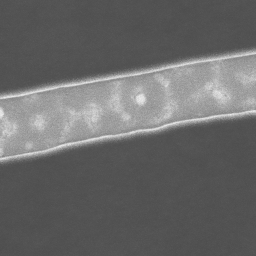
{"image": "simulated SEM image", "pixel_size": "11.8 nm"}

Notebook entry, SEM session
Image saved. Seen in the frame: one or a few lines or trenches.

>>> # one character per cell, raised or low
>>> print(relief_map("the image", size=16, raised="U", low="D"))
UUUUUUUUUUUUUUUU
UUUUUUUUUUUUUUUU
UUUUUUUUUUUUUUUU
UUUUUUUUUUUUUUUD
UUUUUUUUUUDDDDDD
UUUUDDDDDDDDDDDD
DDDDDDDDDDDDDDDD
DDDDDDDDDDDDUUUU
DDDDDDDUUUUUUUUU
DDUUUUUUUUUUUUUU
UUUUUUUUUUUUUUUU
UUUUUUUUUUUUUUUU
UUUUUUUUUUUUUUUU
UUUUUUUUUUUUUUUU
UUUUUUUUUUUUUUUU
UUUUUUUUUUUUUUUU